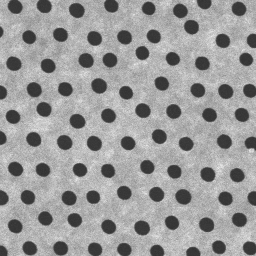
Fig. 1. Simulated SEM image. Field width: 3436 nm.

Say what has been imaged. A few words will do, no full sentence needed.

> a regular array of holes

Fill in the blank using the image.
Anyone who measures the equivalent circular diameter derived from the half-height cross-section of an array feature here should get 197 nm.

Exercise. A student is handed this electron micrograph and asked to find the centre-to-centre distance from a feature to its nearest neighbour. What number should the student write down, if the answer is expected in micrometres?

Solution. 0.368